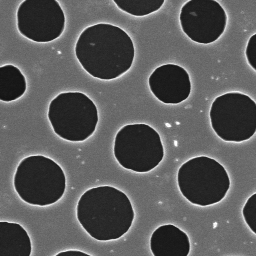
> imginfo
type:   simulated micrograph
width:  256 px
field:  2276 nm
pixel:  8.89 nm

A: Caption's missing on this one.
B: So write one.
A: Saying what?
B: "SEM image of holes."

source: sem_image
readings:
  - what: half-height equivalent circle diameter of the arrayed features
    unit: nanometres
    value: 443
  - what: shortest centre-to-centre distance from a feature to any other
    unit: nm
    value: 644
